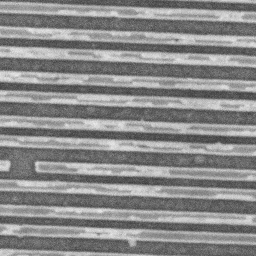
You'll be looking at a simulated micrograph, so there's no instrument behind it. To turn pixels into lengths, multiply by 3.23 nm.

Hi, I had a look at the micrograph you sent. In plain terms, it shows parallel lines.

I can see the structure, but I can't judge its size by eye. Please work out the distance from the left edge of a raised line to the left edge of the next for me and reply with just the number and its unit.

0.0718 microns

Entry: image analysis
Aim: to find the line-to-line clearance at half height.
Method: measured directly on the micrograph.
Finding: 48.9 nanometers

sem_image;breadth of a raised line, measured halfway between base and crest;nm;27.9